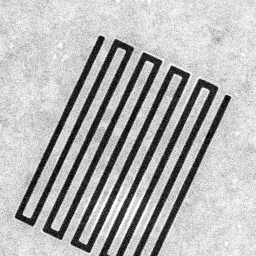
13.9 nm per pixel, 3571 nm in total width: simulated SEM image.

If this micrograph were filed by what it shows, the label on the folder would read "groups of lines, slits or small figures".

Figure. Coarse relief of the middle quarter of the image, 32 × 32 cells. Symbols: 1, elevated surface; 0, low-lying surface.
11111001100111001100110011001111
11111001100110011000110011000011
11110011000110011001100110000000
11110011001100111001100110011001
11100111001100110011001110011001
11100110011001100011001100110001
11001110011001100110011100110011
11001100110001100110011001100011
10011100110011001110111001100110
10011001100011001100110011000110
00111001100110011100110011001100
00110011000110011001100110001100
00110011001100111001100110011001
01100111001100110011001110011001
01100110011000110011001100110001
11001110011001100111001100110011
11001100110001100110011001100011
11011100110011001110111001100110
10011001100011001100110001000110
10111001100110011100110011001100
00110011000110011001100011001100
00110011001100111001100110011101
01100111001100110011000110011001
01100110011000110011001100110001
11001110011001100110001100110011
11001100110001100110011001110011
11011100110011001110011001100110
10011001110011001100110001100110
10111001100110011100110011001100
00110011000110011001100011001100
00110011001100111001100110011000
01100011001100110011000110011001